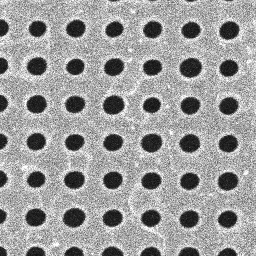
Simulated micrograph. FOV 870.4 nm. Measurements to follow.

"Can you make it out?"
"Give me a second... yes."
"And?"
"a regular array of holes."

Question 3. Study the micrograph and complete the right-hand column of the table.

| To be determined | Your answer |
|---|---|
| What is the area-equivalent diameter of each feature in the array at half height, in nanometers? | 58.9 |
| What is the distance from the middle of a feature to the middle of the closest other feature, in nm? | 128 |